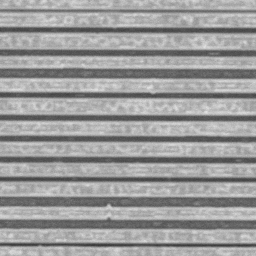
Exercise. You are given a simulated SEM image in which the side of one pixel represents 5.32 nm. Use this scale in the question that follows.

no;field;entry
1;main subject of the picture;parallel lines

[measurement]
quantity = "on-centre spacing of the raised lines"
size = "21.7 pixels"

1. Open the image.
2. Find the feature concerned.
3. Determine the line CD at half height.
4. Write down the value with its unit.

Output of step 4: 69.1 nanometers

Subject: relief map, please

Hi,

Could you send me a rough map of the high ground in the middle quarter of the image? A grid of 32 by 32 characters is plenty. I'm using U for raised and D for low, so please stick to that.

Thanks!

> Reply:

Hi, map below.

UUUUUUUUUUUUUUUUUUUUUUUUUUUUUUUU
DDDDDDDDDDDDDDDDDDDDDDDDDDDDDDDD
DDDDDDDDDDDDDDDDDDDDDDDDDDDDDDDD
DDDDDDDDDDDDDDDDDDDDDDDDDDDDDDDD
UUUUUUUUUUUUUUUUUUUUUUUUUUUUUUUU
UUUUUUUUUUUUUUUUUUUUUUUUUUUUUUUU
UUUUUUUUUUUUUUUUUUUUUUUUUUUUUUUU
DDDDDDDDDDDDDDDDDDDDDDDDDDDDDDDD
DDDDDDDDDDDDDDDDDDDDDDDDDDDDDDDD
UUUUUUUUUUUUUUUUUUUUUUUUUUUUUUUU
UUUUUUUUUUUUUUUUUUUUUUUUUUUUUUUU
UUUUUUUUUUUUUUUUUUUUUUUUUUUUUUUU
DDDDDDDDDDDDDDDDDDDDDDDDDDDDDDDD
DDDDDDDDDDDDDDDDDDDDDDDDDDDDDDDD
DDDDDDDDDDDDDDDDDDDDDDDDDDDDDDDD
UUUUUUUUUUUUUUUUUUUUUUUUUUUUUUUU
UUUUUUUUUUUUUUUUUUUUUUUUUUUUUUUU
UUUUUUUUUUUUUUUUUUUUUUUUUUUUUUUU
DDDDDDDDDDDDDDDDDDDDDDDDDDDDDDDD
DDDDDDDDDDDDDDDDDDDDDDDDDDDDDDDD
UUUUUUUUUUUUUUUUUUUUUUUUUUUUUUUU
UUUUUUUUUUUUUUUUUUUUUUUUUUUUUUUU
UUUUUUUUUUUUUUUUUUUUUUUUUUUUUUUU
DDDDDDDDDDDDDDDDDDDDDDDDDDDDDDDD
DDDDDDDDDDDDDDDDDDDDDDDDDDDDDDDD
UUUUUUUUUUUUUUUUUUUUUUUUUUUUUUUU
UUUUUUUUUUUUUUUUUUUUUUUUUUUUUUUU
UUUUUUUUUUUUUUUUUUUUUUUUUUUUUUUU
DDDDDDDDDDDDDDDDDDDDDDDDDDDDDDDD
DDDDDDDDDDDDDDDDDDDDDDDDDDDDDDDD
UUUUUUUUUUUUUUUUUUUUUUUUUUUUUUUU
UUUUUUUUUUUUUUUUUUUUUUUUUUUUUUUU